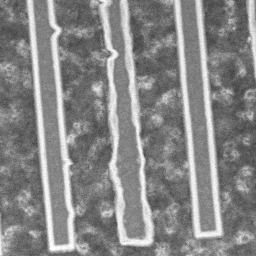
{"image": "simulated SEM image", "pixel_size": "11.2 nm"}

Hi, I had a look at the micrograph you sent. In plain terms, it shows one or a few lines or trenches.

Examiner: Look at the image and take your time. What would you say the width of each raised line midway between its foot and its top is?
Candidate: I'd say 0.244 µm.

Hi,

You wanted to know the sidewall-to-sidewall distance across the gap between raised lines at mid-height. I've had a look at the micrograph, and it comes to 576 nm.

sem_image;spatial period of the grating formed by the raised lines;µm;0.827